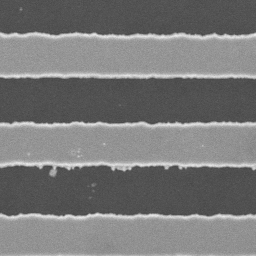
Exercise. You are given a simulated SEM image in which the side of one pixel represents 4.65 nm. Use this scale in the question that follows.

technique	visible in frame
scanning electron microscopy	lines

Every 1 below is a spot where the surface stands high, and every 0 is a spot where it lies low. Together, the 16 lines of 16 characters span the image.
0000000000000000
0000000000000000
1111111111111111
1111111111111111
1111111111111111
0000000000000000
0000000000000000
0000000000000000
1111111111111111
1111111111111111
0000000000000000
0000000000000000
0000000000000000
1111111111111111
1111111111111111
1111111111111111